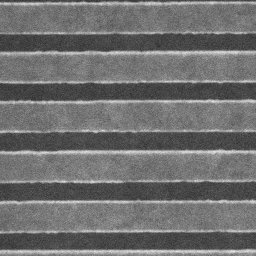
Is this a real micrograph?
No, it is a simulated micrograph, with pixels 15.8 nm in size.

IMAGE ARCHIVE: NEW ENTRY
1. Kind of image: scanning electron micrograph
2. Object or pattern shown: lines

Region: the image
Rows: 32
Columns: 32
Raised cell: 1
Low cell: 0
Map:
11111111111111111111111111111111
11111111111111111111111111111111
11111111111111111111111111111111
11111111111111111111111111111111
00000000000000000000000000000000
00000000000000000000000000000000
00000010000000111111011111111111
11111111111111111111111111111111
11111111111111111111111111111111
11111111111111111111111111111111
00000000000000000000000000000000
00000000000000000000000000000000
00000000000000000000000000000011
11111111111111111111111111111111
11111111111111111111111111111111
11111111111111111111111111111111
11111111000110011000000000000000
00000000000000000000000000000000
00000000000000000000000000000000
11111111111111111111111111111111
11111111111111111111111111111111
11111111111111111111111111111111
11111111111111111111111111111111
00000000000000000000000000000000
00000000000000000000000000000000
11111111111111111111111111111111
11111111111111111111111111111111
11111111111111111111111111111111
11111111111111111111111111111111
00000000000000000000000000000000
00000000000000000000000000000000
11111111111111111111111111111111